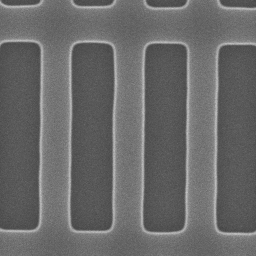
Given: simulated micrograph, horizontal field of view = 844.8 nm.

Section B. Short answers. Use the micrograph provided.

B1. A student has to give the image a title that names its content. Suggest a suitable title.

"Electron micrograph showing groups of lines, slits or small figures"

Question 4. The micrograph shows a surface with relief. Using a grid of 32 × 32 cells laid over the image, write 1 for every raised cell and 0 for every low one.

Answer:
00000111100000111100000111110000
11111111111111111111111111111111
11111111111111111111111111111111
11111111111111111111111111111111
11111111111111111111111111111111
00000111100000111110000111111001
00000111100000111100000111100000
00000111100000111100000011100000
00000111100000111100000011100000
00000111100000111100000011100000
00000111100000111100000011100000
00000111100000111100000011100000
00000111100000111100000111100000
00000111100000111100000111100000
00000111100000111100000011100000
00000111100000111100000111100000
00000111100000111100000111100000
00000111100000111100000111100000
00000111100000111100000111100000
00000111100000111100000111100000
00000111100000111100000111100000
00000111100000111100000111100000
00000111100000111100000111100000
00000111100000111100000111100000
00000111100000111100000111100000
00000111100000111100000111100000
00000111100000111100000111100000
00000111100000111100000111100000
00000111100000111100000111100000
11111111111111111111111111111111
11111111111111111111111111111111
11111111111111111111111111111111